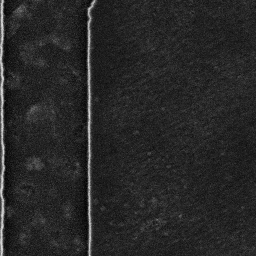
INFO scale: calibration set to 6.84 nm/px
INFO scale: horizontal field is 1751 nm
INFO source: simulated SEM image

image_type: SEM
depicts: one or a few lines or trenches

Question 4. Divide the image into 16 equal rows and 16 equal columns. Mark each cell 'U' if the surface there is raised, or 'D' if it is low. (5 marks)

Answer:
DDDDDDUUUUUUUUUU
DDDDDDUUUUUUUUUU
DDDDDDUUUUUUUUUU
DDDDDDUUUUUUUUUU
DDDDDDUUUUUUUUUU
DDDDDDUUUUUUUUUU
DDDDDDUUUUUUUUUU
DDDDDDUUUUUUUUUU
DDDDDDUUUUUUUUUU
DDDDDDUUUUUUUUUU
DDDDDDUUUUUUUUUU
DDDDDDUUUUUUUUUU
DDDDDDUUUUUUUUUU
DDDDDDUUUUUUUUUU
DDDDDDUUUUUUUUUU
DDDDDDUUUUUUUUUU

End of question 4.